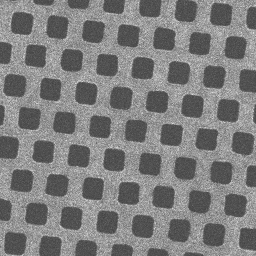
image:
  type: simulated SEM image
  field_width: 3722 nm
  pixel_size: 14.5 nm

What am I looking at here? a regular array of holes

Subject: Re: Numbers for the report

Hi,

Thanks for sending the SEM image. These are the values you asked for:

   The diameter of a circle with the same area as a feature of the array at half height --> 0.349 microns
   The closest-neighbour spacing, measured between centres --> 0.516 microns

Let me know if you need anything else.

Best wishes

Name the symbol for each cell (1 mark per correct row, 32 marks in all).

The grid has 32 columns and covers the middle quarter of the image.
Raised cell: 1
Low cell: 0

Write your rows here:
00000111000000111000000111000001
00001111000000111000001111000000
11111111100001111000001111000000
11111111111111111100001111000001
11110111111111111111111111000001
11100000111110111111111111111111
11100000111100000111111111111111
11100000111100000111100000111111
11100000111000000111100000111100
11100000111000000111000000111000
11111111111100000111000000111000
11111111111111101111100000111000
00111111111111111111111111111000
00011110000111111111111111111111
00011100000011110000111111111111
00011100000011100000011110000011
00011100000011100000011100000011
00111100000011100000011100000011
11111111100111100000011100000011
11111111111111111000111100000111
11000111111111111111111111100111
10000011110000111111111111111111
10000001110000011110000111111111
10000001110000011110000011110000
10000011110000011110000011110000
11000011110000011110000011110000
11111111111000011110000011100000
11111111111111111110000011110000
01111000011111111111111111110000
01111000001111100011111111111111
01111000001111000001111011111111
01110000001111000001110000001111